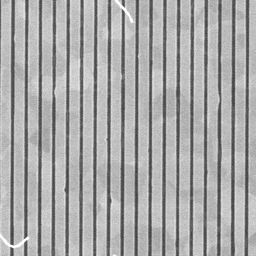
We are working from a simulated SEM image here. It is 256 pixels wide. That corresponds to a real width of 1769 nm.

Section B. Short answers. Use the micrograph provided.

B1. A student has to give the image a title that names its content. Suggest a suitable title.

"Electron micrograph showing parallel lines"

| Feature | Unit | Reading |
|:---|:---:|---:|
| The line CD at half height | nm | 62.2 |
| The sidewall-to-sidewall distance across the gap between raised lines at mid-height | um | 0.0328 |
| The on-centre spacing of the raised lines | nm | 95.3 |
